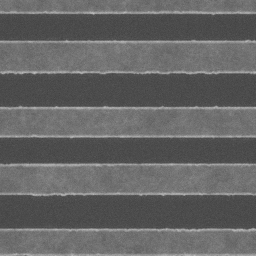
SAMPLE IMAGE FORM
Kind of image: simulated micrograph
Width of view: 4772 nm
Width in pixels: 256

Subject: lines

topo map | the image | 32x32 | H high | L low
HHHHHHHHHHHHHHHHHHHHHHHHHHHHHHHH
HHHHHHHHHHHHHHHHHHHHHHHHHHHHHHHH
LLLLLLLLLLLLLLLLLLLLLLLLLLLLLLLL
LLLLLLLLLLLLLLLLLLLLLLLLLLLLLLLL
LLLLLLLLLLLLLLLLLLLLLLLLLLLLLLLL
HHHHHHHHHHHHHHHHHHHHHHHHHHHHHHHH
HHHHHHHHHHHHHHHHHHHHHHHHHHHHHHHH
HHHHHHHHHHHHHHHHHHHHHHHHHHHHHHHH
HHHHHHHHHHHHHHHHHHHHHHHHHHHHHHHH
LLLLLLLLLLLLLLLLLLLLLLLLLLLLLLLL
LLLLLLLLLLLLLLLLLLLLLLLLLLLLLLLL
LLLLLLLLLLLLLLLLLLLLLLLLLLLLLLLL
LLLLLLLLLLLLLLLLLLLLLLLLLLLLLLLL
HHHHHHHHHHHLHHHHHHHHHHLHHHHHHHHH
HHHHHHHHHHHHHHHHHHHHHHHHHHHHHHHH
HHHHHHHHHHHHHHHHHHHHHHHHHHHHHHHH
HHHHHHHHHHHHHHHHHHHHHHHHHHHHHHHH
LLLLLLLLLLLLLLLLLLLLLLLLLLLLLLLL
LLLLLLLLLLLLLLLLLLLLLLLLLLLLLLLL
LLLLLLLLLLLLLLLLLLLLLLLLLLLLLLLL
LLLLLLLLLLLLLLLLLLLLLLLLLLLLLLLL
HHHHHHHHHHHHHHHHHHHHHHHHHHHHHHHH
HHHHHHHHHHHHHHHHHHHHHHHHHHHHHHHH
HHHHHHHHHHHHHHHHHHHHHHHHHHHHHHHH
LLLLLLLLLLLLLLLLLLLLLLLLLLLLLLLL
LLLLLLLLLLLLLLLLLLLLLLLLLLLLLLLL
LLLLLLLLLLLLLLLLLLLLLLLLLLLLLLLL
LLLLLLLLLLLLLLLLLLLLLLLLLLLLLLLL
LLLLLLLLLLLLLLLLLLLLLLLLLLLLLLLL
HHHHHHHHHHHHHHHHHHHHHHHHHHHHHHHH
HHHHHHHHHHHHHHHHHHHHHHHHHHHHHHHH
HHHHHHHHHHHHHHHHHHHHHHHHHHHHHHHH